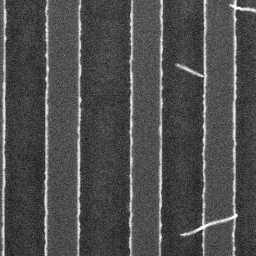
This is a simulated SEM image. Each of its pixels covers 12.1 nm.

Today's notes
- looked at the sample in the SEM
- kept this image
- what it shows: lines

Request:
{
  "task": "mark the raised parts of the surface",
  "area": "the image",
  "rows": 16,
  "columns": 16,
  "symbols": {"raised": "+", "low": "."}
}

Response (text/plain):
...++...++...++.
...++...++...++.
...++...++...++.
...++...++...++.
...++...++...++.
...++...++...++.
...++...++...++.
...++...++...++.
...++...++...++.
...++...++...++.
...++...++...++.
...++...++...++.
...++...++...++.
...++...++...++.
...++...++...++.
...++...++...++.